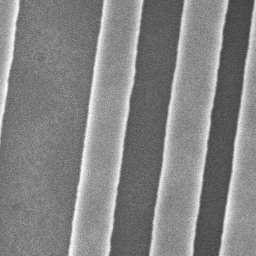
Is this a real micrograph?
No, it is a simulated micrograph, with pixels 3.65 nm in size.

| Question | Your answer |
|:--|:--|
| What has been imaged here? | lines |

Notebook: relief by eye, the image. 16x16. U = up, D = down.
UDDDDDUUUDDUUUDD
UDDDDDUUUDDUUUDD
UDDDDDUUUDDUUUDD
UDDDDDUUDDDUUUDU
UDDDDDUUDDDUUUDU
DDDDDDUUDDDUUDDU
DDDDDDUUDDDUUDDU
DDDDDUUUDDUUUDDU
DDDDDUUUDDUUUDDU
DDDDDUUUDDUUUDDU
DDDDDUUUDDUUUDDU
DDDDDUUDDDUUUDUU
DDDDDUUDDDUUDDUU
DDDDDUUDDDUUDDUU
DDDDDUUDDDUUDDUU
DDDDUUUDDUUUDDUU